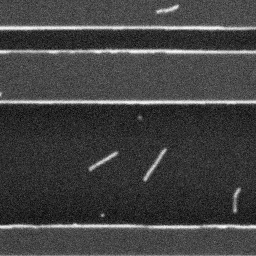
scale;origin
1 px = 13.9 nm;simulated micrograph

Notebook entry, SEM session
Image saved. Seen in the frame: lines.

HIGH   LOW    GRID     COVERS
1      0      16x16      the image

1111111111111111
1111111111111111
1111111111111111
1111111111111111
1111111111111111
1111111111111111
0000000000000000
0000000000000000
0000000000000000
0000000000000000
0000000000000000
0000000000000000
0000000000000000
0000000000000000
1111111111111111
1111111111111111